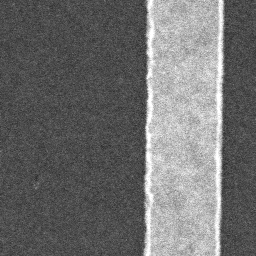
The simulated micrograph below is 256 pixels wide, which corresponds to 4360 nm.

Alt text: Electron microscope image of one or a few lines or trenches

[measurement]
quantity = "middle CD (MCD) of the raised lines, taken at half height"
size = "1160 nanometers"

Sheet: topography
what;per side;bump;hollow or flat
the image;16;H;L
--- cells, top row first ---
LLLLLLLLLHHHHHLL
LLLLLLLLLHHHHHLL
LLLLLLLLLHHHHHLL
LLLLLLLLLHHHHHLL
LLLLLLLLLHHHHHLL
LLLLLLLLLHHHHHLL
LLLLLLLLLHHHHHLL
LLLLLLLLLHHHHHLL
LLLLLLLLLHHHHHLL
LLLLLLLLLHHHHHLL
LLLLLLLLLHHHHHLL
LLLLLLLLLHHHHHLL
LLLLLLLLLHHHHHLL
LLLLLLLLLHHHHHLL
LLLLLLLLLHHHHHLL
LLLLLLLLLHHHHHLL